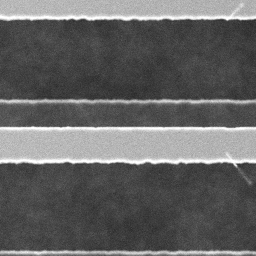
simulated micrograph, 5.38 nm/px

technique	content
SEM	lines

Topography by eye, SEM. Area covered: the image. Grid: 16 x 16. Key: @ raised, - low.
@@@@@@@@@@@@@@@@
----------------
----------------
----------------
----------------
----------------
@@@@@@@@@@@@@@@@
@@@@@@@@@@@@@@@@
@@@@@@@@@@@@@@@@
@@@@@@@@@@@@@@@@
----------------
----------------
----------------
----------------
----------------
----------------